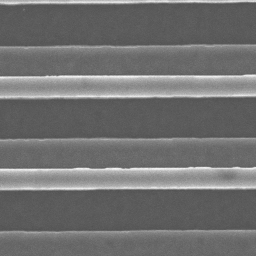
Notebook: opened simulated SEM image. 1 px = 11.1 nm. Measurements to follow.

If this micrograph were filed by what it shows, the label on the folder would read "lines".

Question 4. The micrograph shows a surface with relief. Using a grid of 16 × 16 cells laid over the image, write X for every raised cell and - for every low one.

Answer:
----------------
----------------
----------------
XXXXXXXXXXXXXXXX
XXXXXXXXXXXXXXXX
XXXXXXXXXXXXXXXX
----------------
----------------
----------------
XXXXXXXXXXXXXXXX
XXXXXXXXXXXXXXXX
XXXXXXXXXXXXXXXX
----------------
----------------
-------XXXXXXXXX
XXXXXXXXXXXXXXXX